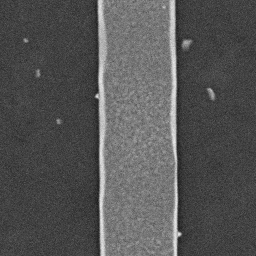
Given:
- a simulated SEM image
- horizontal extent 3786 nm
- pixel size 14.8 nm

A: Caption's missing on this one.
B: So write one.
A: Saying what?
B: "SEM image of wiring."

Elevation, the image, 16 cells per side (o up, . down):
......ooooo.....
......ooooo.....
......ooooo.....
......ooooo.....
......ooooo.....
......ooooo.....
......ooooo.....
......ooooo.....
......ooooo.....
......ooooo.....
......ooooo.....
......ooooo.....
......ooooo.....
......ooooo.....
......ooooo.....
......ooooo.....